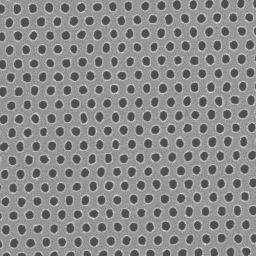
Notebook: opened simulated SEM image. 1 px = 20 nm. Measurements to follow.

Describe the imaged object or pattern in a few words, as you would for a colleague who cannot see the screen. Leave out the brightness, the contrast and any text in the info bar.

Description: a regular array of holes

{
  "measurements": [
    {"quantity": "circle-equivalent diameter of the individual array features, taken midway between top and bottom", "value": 8.52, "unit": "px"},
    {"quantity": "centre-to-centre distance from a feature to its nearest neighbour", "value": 309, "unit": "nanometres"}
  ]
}